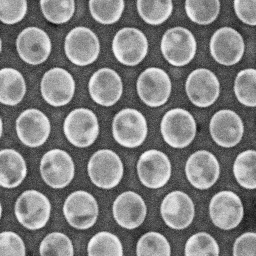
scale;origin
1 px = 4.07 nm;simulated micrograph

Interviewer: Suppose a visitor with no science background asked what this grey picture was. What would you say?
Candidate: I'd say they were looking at a regular array of raised bodies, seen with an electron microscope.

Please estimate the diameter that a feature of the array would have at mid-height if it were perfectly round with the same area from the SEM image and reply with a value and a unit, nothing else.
142 nm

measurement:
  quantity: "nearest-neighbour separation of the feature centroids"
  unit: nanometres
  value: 193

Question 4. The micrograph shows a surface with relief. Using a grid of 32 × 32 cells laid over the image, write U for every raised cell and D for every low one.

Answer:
UUUDDUUUUDDUUUUDDUUUUDDUUUUDDUUU
UUUDDUUUUDDUUUUDDUUUUDDUUUUDDDUU
UUDDDDUUDDDDUUDDDDUUDDDDUUUDDDUU
DDDDDDDDDDDDDDDDDDDDDDDDDDDDDDDD
DDUUUUDDUUUUDDUUUUDDDUUUDDDUUUDD
DDUUUUDDUUUUDDUUUUDDUUUUDDUUUUDD
DDUUUUDDUUUUDDUUUUDDUUUUDDUUUUDD
DDDUUUDDDUUUDDDUUUDDDUUUDDDUUUDD
DDDDDDDDDDDDDDDDDDDDDDDDDDDDDDDD
UUUDDDUUUDDDUUUDDDUUUDDDUUUDDDUU
UUUDDUUUUDDUUUUDDUUUUDDUUUUDDUUU
UUUDDUUUUDDUUUUDDUUUUDDUUUUDDUUU
UUDDDDUUUDDDUUUDDDUUUDDDUUUDDDUU
DDDDDDDDDDDDDDDDDDDDDDDDDDDDDDDD
DDDUUUDDDUUUDDDUUUDDDUUUDDDUUUDD
DDUUUUDDUUUUDDUUUUDDUUUUDDUUUUDD
DDUUUUDDUUUUDDUUUUDDUUUUDDUUUUDD
DDDUUUDDDUUUDDDUUUDDDUUUDDDUUUDD
DDDDDDDDDDDDDDDDDDDDDDDDDDDDDDDD
UUUDDDUUDDDDUUUDDDUUUDDDUUUDDDUU
UUUDDUUUUDDUUUUDDUUUUDDUUUUDDUUU
UUUDDUUUUDDUUUUDDUUUUDDUUUUDDUUU
UUUDDDUUUDDDUUUDDDUUUDDDUUUDDDUU
DDDDDDDDDDDDDDDDDDDDDDDDDDDDDDDD
DDDUUDDDDUUDDDDUUDDDDUUDDDDUUDDD
DDUUUUDDUUUUDDUUUUDDUUUUDDUUUUDD
DDUUUUDDUUUUDDUUUUDDUUUUDDUUUUDD
DDUUUUDDUUUUDDDUUUDDDUUUDDDUUUDD
DDDDDDDDDDUDDDDDDDDDDDUDDDDDUDDD
UUDDDDUUDDDDUUDDDDUUDDDDUUDDDDUU
UUUDDUUUUDDUUUUDDUUUUDDUUUUDDUUU
UUUDDUUUUDDUUUUDDUUUUDDUUUUDDUUU